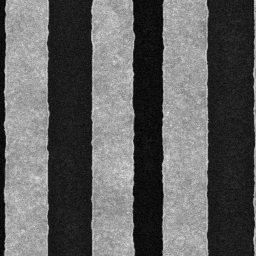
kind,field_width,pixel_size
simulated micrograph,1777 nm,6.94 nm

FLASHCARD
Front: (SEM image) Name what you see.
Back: lines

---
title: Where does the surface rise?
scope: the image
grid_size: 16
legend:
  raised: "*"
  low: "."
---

***...**..***...
***...**..***...
***...**..***...
***...**..***...
***...**..***...
***...**..***...
***...**..***...
***...**..***...
***...**..***...
***...**..***...
***...**..***...
***...**..***...
***...**..***...
***...**..***...
***...**..***...
***...**..***...